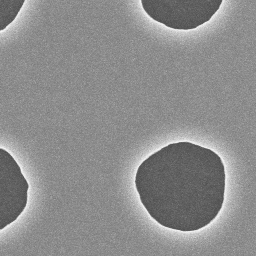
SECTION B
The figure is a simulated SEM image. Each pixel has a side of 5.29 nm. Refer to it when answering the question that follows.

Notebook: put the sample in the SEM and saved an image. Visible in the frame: holes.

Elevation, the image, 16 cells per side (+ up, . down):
.++++++++.....++
.+++++++++...+++
++++++++++++++++
++++++++++++++++
++++++++++++++++
++++++++++++++++
++++++++++++++++
++++++++++++++++
++++++++++++++++
++++++++++...+++
.++++++++.....++
..+++++++.....++
..+++++++.....++
.++++++++....+++
++++++++++++++++
++++++++++++++++